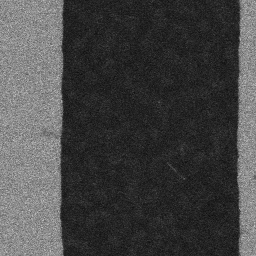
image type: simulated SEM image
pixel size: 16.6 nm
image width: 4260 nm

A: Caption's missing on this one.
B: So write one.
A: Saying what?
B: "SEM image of one or a few lines or trenches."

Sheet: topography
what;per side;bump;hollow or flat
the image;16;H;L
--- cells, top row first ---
LLLLHHHHHHHHHHHL
LLLLHHHHHHHHHHHL
LLLLHHHHHHHHHHHL
LLLLHHHHHHHHHHHL
LLLLHHHHHHHHHHHL
LLLLHHHHHHHHHHHL
LLLLHHHHHHHHHHHL
LLLLHHHHHHHHHHHL
LLLLHHHHHHHHHHHL
LLLLHHHHHHHHHHHL
LLLLHHHHHHHHHHHL
LLLLHHHHHHHHHHHL
LLLLHHHHHHHHHHHL
LLLLHHHHHHHHHHHL
LLLLHHHHHHHHHHHL
LLLLHHHHHHHHHHHL